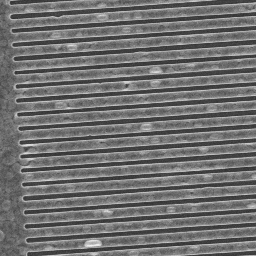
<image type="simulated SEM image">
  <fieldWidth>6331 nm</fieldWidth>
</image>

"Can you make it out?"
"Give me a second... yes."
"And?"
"parallel lines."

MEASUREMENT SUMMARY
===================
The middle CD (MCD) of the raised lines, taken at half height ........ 234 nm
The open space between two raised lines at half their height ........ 117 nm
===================